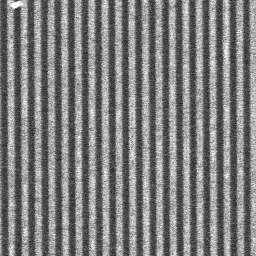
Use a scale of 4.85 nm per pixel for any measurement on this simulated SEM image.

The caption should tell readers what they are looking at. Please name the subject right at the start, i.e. parallel lines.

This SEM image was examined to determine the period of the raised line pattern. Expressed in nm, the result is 65.3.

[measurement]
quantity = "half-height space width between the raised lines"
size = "34.5 nm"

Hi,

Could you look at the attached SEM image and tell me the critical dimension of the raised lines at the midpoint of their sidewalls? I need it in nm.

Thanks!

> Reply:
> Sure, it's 30.3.